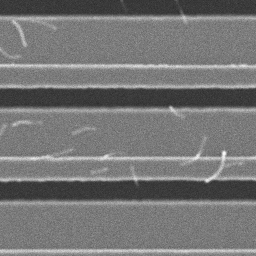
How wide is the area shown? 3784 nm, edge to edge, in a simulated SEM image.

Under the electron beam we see lines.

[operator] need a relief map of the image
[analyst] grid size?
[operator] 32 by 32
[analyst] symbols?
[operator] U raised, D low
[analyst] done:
DDDDDDDDDDDDDDDDDDDDDDDDDDDDDDDD
DDDDDDDDDDDDDDDDDDDDDDDDDDDDDDDD
UUUUUUUUUUUUUUUUUUUUUUUUUUUUUUUU
UUUUUUUUUUUUUUUUUUUUUUUUUUUUUUUU
UUUUUUUUUUUUUUUUUUUUUUUUUUUUUUUU
UUUUUUUUUUUUUUUUUUUUUUUUUUUUUUUU
UUUUUUUUUUUUUUUUUUUUUUUUUUUUUUUU
UUUUUUUUUUUUUUUUUUUUUUUUUUUUUUUU
UUUUUUUUUUUUUUUUUUUUUUUUUUUUUUUU
UUUUUUUUUUUUUUUUUUUUUUUUUUUUUUUU
UUUUUUUUUUUUUUUUUUUUUUUUUUUUUUUU
DDDDDDDDDDDDDDDDDDDDDDDDDDDDDDDD
DDDDDDDDDDDDDDDDDDDDDDDDDDDDDDDD
DDDDDDDDDDDDDDDDDDDDDDDDDDDDDDDD
UUUUUUUUUUUUUUUUUUUUUUUUUUUUUUUU
UUUUUUUUUUUUUUUUUUUUUUUUUUUUUUUU
UUUUUUUUUUUUUUUUUUUUUUUUUUUUUUUU
UUUUUUUUUUUUUUUUUUUUUUUUUUUUUUUU
UUUUUUUUUUUUUUUUUUUUUUUUUUUUUUUU
UUUUUUUUUUUUUUUUUUUUUUUUUUUUUUUU
UUUUUUUUUUUUUUUUUUUUUUUUUUUUUUUU
UUUUUUUUUUUUUUUUUUUUUUUUUUUUUUUU
UUUUUUUUUUUUUUUDUUUDDUDUUUUUDDDD
DDDDDDDDDDDDDDDDDDDDDDDDDDDDDDDD
DDDDDDDDDDDDDDDDDDDDDDDDDDDDDDDD
UUUUUUUUUUUUUUUUUUUUUUUUUUUUUUUU
UUUUUUUUUUUUUUUUUUUUUUUUUUUUUUUU
UUUUUUUUUUUUUUUUUUUUUUUUUUUUUUUU
UUUUUUUUUUUUUUUUUUUUUUUUUUUUUUUU
UUUUUUUUUUUUUUUUUUUUUUUUUUUUUUUU
UUUUUUUUUUUUUUUUUUUUUUUUUUUUUUUU
UUUUUUUUUUUUUUUUUUUUUUUUUUUUUUUU